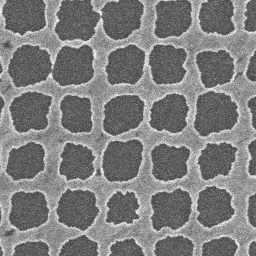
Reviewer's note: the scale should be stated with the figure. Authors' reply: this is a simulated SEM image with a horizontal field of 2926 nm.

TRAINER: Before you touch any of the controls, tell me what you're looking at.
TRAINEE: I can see a regular array of holes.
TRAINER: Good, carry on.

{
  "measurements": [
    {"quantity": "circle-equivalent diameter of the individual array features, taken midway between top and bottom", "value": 458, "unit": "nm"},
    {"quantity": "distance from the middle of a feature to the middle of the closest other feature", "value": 520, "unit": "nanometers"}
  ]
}